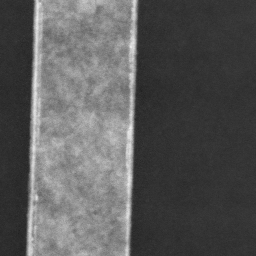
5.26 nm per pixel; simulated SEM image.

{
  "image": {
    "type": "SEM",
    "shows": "one or a few lines or trenches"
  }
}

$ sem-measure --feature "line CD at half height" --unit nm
510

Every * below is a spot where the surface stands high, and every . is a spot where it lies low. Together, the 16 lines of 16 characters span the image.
..******........
..******........
..******........
..******........
..******........
..******........
..******........
..******........
..******........
..******........
..******........
..******........
..******........
..******........
..******........
..******........